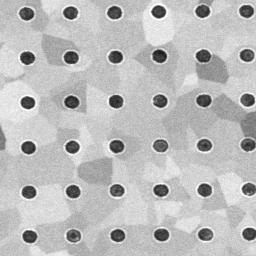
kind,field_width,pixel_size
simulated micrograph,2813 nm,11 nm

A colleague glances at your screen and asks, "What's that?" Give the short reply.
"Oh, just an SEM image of a regular array of holes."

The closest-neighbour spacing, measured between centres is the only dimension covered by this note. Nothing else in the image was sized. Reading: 482 nm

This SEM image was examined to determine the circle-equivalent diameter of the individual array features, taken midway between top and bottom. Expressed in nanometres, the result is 166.